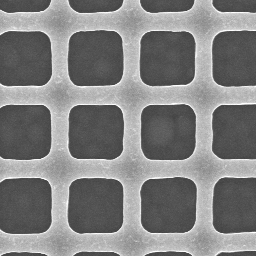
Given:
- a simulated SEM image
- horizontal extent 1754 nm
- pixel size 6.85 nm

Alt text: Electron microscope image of holes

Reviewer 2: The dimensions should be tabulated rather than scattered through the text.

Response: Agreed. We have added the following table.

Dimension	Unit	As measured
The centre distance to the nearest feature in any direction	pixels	72.1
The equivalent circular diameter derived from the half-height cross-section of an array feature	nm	416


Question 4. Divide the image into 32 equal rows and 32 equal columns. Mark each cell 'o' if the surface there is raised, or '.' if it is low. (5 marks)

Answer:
......ooo......ooo......ooo.....
o....ooooo....oooo.....ooooo....
oooooooooooooooooooooooooooooooo
oooooooooooooooooooooooooooooooo
......ooo......ooo......ooo.....
......ooo......ooo.......oo.....
......ooo......oo.......oo......
......oo........o.......oo......
.......o........o.......oo......
......ooo......ooo......ooo.....
......ooo.....oooo......ooo.....
oooooooooooooooooooooooooooooooo
oooooooooooooooooooooooooooooooo
......ooo......ooo......ooo.....
......ooo......ooo......ooo.....
......ooo.......oo.......o......
.......oo.......oo......ooo.....
.......oo......ooo.......o......
......ooo......ooo......oo......
......ooo......ooo......ooo.....
oooooooooooooooooooooooooooooooo
oooooooooooooooooooooooooooooooo
o.....ooo......ooo......ooo.....
......ooo......ooo.......oo.....
.......oo......ooo.......oo.....
.......o.......ooo.......o......
.......o.......ooo.......o......
.......o.......ooo......oo......
......ooo......ooo......ooo.....
oooooooooooooooooooooooooooooooo
oooooooooooooooooooooooooooooooo
oooooooooo....ooooo....ooooo....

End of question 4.